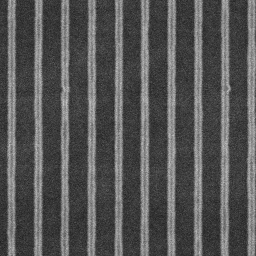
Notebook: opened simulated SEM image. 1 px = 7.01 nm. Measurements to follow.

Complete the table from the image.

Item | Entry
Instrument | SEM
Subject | parallel lines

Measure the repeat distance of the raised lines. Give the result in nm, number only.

187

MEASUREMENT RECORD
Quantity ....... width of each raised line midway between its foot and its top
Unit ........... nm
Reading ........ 34.2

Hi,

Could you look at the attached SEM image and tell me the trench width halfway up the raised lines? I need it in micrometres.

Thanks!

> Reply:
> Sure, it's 0.151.